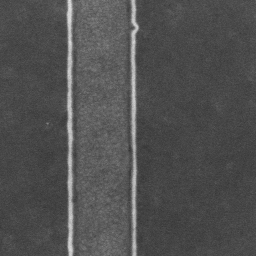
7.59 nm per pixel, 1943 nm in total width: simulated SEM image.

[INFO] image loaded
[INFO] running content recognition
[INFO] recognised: one or a few lines or trenches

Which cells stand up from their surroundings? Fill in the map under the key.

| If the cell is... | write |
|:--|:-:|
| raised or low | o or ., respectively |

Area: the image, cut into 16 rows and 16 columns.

oooo....oooooooo
oooo....oooooooo
oooo....oooooooo
oooo....oooooooo
oooo....oooooooo
oooo....oooooooo
oooo....oooooooo
oooo....oooooooo
oooo....oooooooo
oooo....oooooooo
oooo....oooooooo
oooo....oooooooo
oooo....oooooooo
oooo....oooooooo
oooo....oooooooo
oooo....oooooooo